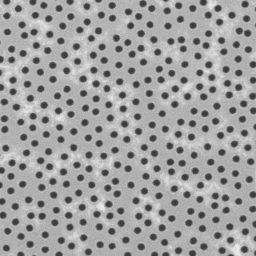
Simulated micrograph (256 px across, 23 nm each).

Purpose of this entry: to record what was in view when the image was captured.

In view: a regular array of holes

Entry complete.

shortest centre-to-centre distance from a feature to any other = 289 nanometers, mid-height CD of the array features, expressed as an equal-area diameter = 176 nanometers